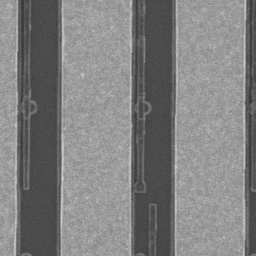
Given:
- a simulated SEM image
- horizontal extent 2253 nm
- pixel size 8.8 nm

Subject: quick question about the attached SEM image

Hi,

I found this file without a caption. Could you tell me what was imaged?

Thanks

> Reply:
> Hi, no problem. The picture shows wiring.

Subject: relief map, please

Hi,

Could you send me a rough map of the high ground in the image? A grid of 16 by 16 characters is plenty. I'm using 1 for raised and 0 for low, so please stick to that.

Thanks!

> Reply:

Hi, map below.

1000111100011110
1000111100011110
1000111100011110
1000111100011110
1000111100011110
1000111100011110
1000111110011110
1000111100011110
1000111100011110
1000111100011110
1000111100011110
1000111100011110
1000111100011110
1000111100011110
1000111100011110
1000111100011110